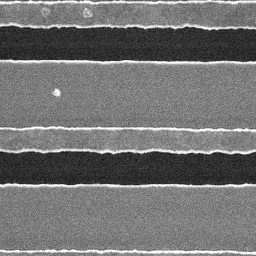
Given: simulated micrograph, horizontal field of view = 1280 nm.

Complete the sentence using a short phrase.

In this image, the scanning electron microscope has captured lines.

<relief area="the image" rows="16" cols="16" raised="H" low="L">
HHHHHHHHHHHHHHHH
HHHHHHHHHHHHHHHH
LLLLLLLLLLLLLLLL
LLLLLLLLLLLLLLLL
HHHHHHHHHHHHHHHH
HHHHHHHHHHHHHHHH
HHHHHHHHHHHHHHHH
HHHHHHHHHHHHHHHH
HHHHHHHHHHHHHHHH
LLLLLLHHHLHHHHHH
LLLLLLLLLLLLLLLL
LLLLLLLLLLLLLLLL
HHHHHHHHHHHHHHHH
HHHHHHHHHHHHHHHH
HHHHHHHHHHHHHHHH
HHHHHHHHHHHHHHHH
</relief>